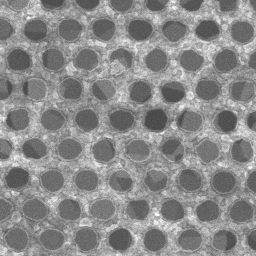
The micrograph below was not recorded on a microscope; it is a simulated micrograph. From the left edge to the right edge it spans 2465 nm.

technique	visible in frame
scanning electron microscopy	a regular array of raised bodies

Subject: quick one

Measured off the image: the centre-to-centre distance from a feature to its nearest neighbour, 323 nm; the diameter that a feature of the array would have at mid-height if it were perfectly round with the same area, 24.1 pixels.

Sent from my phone